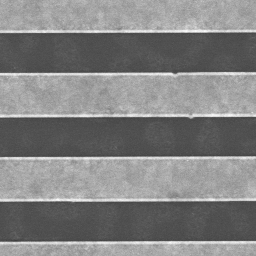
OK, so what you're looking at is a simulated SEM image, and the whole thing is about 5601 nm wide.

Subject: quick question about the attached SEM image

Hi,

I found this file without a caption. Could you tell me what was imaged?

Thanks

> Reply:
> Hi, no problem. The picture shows one or a few lines or trenches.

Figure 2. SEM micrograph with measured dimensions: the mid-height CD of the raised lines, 916 nanometres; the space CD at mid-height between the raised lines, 936 nanometres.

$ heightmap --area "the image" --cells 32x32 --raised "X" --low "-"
XXXXXXXXXXXXXXXXXXXXXXXXXXXXXXXX
XXXXXXXXXXXXXXXXXXXXXXXXXXXXXXXX
XXXXXXXXXXXXXXXXXXXXXXXXXXXXXXXX
XXXXXXXXXXXXXXXXXXXXXXXXXXXXXXXX
--------------------------------
--------------------------------
--------------------------------
--------------------------------
--------------------------------
XXXXXXXXXXXXXXXXXXXXXXXXXXXXXXXX
XXXXXXXXXXXXXXXXXXXXXXXXXXXXXXXX
XXXXXXXXXXXXXXXXXXXXXXXXXXXXXXXX
XXXXXXXXXXXXXXXXXXXXXXXXXXXXXXXX
XXXXXXXXXXXXXXXXXXXXXXXXXXXXXXXX
--------------------------------
--------------------------------
--------------------------------
--------------------------------
--------------------------------
--------------------------------
XXXXXXXXXXXXXXXXXXXXXXXXXXXXXXXX
XXXXXXXXXXXXXXXXXXXXXXXXXXXXXXXX
XXXXXXXXXXXXXXXXXXXXXXXXXXXXXXXX
XXXXXXXXXXXXXXXXXXXXXXXXXXXXXXXX
XXXXXXXXXXXXXXXXXXXXXXXXXXXXXXXX
--------------------------------
--------------------------------
--------------------------------
--------------------------------
--------------------------------
XXXXXXXXXXXXXXXXXXXXXXXXXXXXXXXX
XXXXXXXXXXXXXXXXXXXXXXXXXXXXXXXX